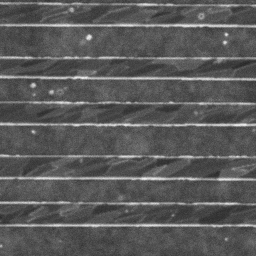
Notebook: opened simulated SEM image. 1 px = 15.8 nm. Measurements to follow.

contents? lines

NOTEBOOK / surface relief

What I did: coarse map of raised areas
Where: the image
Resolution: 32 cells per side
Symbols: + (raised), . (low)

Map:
++++++.+.+......................
++++++++++++++++++++++++++++++++
++++++++++++++++++++++++++++++++
................................
................................
................................
................................
++++++++++++++++++++++++++++++++
++++++++++++++++++++++++++++++++
++++++++++++++++++++++++++++++++
................................
................................
................................
++++++++++++++++++++++++++++++++
++++++++++++++++++++++++++++++++
++++++++++++++++++++++++++++++++
................................
................................
................................
+...............................
++++++++++++++++++++++++++++++++
++++++++++++++++++++++++++++++++
................................
................................
................................
+++++++++++++++++++++++.+++++...
++++++++++++++++++++++++++++++++
++++++++++++++++++++++++++++++++
................................
................................
................................
................................